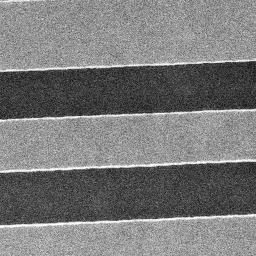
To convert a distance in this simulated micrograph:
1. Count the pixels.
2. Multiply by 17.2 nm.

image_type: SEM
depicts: lines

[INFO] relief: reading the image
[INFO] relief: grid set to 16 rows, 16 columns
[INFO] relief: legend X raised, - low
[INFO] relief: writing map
XXXXXXXXXXXXXXXX
XXXXXXXXXXXXXXXX
XXXXXXXXXXXXXXXX
XXXXXXXXXXXXXXXX
----------------
----------------
----------------
-XXXXXXXXXXXXXXX
XXXXXXXXXXXXXXXX
XXXXXXXXXXXXXXXX
XXXXX-----------
----------------
----------------
---------------X
XXXXXXXXXXXXXXXX
XXXXXXXXXXXXXXXX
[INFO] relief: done